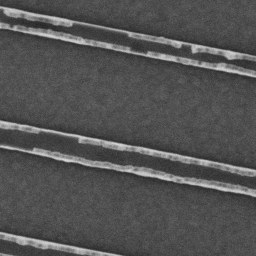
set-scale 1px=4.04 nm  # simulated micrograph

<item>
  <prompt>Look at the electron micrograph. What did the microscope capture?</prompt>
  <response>one or a few lines or trenches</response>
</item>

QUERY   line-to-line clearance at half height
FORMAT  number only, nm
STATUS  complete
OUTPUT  369